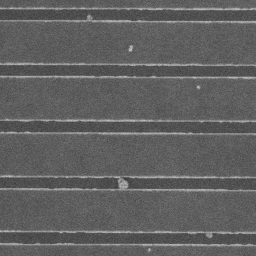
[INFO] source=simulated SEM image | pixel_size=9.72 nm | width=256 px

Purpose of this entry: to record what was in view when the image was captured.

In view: lines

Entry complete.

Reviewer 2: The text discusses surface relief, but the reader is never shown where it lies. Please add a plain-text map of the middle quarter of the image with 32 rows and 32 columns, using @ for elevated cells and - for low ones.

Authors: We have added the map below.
--------------------------------
--------------------------------
--------------------------------
@@@@@@@@@@@@@@@@@@@@@@@@@@@@@@@@
@@@@@@@@@@@@@@@@@@@@@@@@@@@@@@@@
@@@@@@@@@@@@@@@@@@@@@@@@@@@@@@@@
@@@@@@@@@@@@@@@@@@@@@@@@@@@@@@@@
@@@@@@@@@@@@@@@@@@@@@@@@@@@@@@@@
@@@@@@@@@@@@@@@@@@@@@@@@@@@@@@@@
@@@@@@@@@@@@@@@@@@@@@@@@@@@@@@@@
@@@@@@@@@@@@@@@@@@@@@@@@@@@@@@@@
@@@@@@@@@@@@@@@@@@@@@@@@@@@@@@@@
@@@@@@@@@@@@@@@@@@@@@@@@@@@@@@@@
@@@@@@@@@@@@@@@@@@@@@@@@@@@@@@@@
--------------------------------
--------------------------------
--------------------------------
@@@@@@@@@@@@@@@@@@@@@@@@@@-@@@--
@@@@@@@@@@@@@@@@@@@@@@@@@@@@@@@@
@@@@@@@@@@@@@@@@@@@@@@@@@@@@@@@@
@@@@@@@@@@@@@@@@@@@@@@@@@@@@@@@@
@@@@@@@@@@@@@@@@@@@@@@@@@@@@@@@@
@@@@@@@@@@@@@@@@@@@@@@@@@@@@@@@@
@@@@@@@@@@@@@@@@@@@@@@@@@@@@@@@@
@@@@@@@@@@@@@@@@@@@@@@@@@@@@@@@@
@@@@@@@@@@@@@@@@@@@@@@@@@@@@@@@@
@@@@@@@@@@@@@@@@@@@@@@@@@@@@@@@@
@@@@@@@@@@@@@@@@@@@@@@@@@@@@@@@@
-------------@------------------
--------------@-----------------
--------------@@----------------
@@@@@@@@@@@@@@@@@@@@@@@@@@@@@@@@